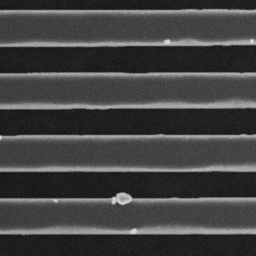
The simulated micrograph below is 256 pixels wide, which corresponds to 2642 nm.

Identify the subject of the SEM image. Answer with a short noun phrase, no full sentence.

lines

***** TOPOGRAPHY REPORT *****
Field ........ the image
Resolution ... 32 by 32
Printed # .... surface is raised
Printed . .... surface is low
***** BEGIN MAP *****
................................
################################
################################
################################
################################
#######################.#####...
................................
................................
................................
################################
################################
################################
################################
................................
................................
................................
................................
################################
################################
################################
################################
................................
................................
................................
..............##................
################################
################################
################################
################################
................................
................................
................................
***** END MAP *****